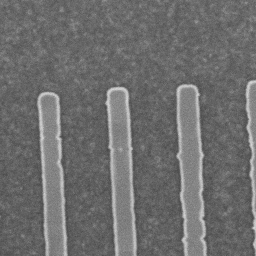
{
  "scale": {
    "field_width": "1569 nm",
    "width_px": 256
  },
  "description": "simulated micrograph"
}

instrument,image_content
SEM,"one or a few lines or trenches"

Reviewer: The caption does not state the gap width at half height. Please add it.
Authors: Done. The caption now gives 308 nanometres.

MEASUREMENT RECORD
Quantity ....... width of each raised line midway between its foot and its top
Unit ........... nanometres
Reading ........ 119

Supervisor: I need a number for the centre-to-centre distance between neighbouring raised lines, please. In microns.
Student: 0.426